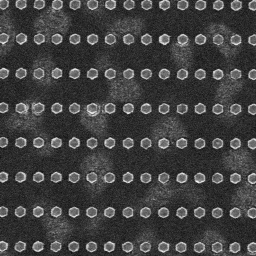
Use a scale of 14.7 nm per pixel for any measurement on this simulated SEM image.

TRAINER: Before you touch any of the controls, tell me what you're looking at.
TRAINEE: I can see a regular array of raised bodies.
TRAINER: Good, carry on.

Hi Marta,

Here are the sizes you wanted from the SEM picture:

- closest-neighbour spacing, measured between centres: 261 nm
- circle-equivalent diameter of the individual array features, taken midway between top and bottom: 147 nanometers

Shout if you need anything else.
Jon